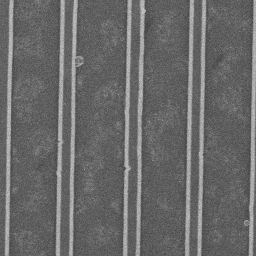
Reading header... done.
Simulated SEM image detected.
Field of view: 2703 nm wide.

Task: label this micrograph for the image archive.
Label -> one or a few lines or trenches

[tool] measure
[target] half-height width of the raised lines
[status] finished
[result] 127 nanometres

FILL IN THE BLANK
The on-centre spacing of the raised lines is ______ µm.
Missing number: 0.681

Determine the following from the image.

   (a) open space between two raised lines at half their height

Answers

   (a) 542 nanometres